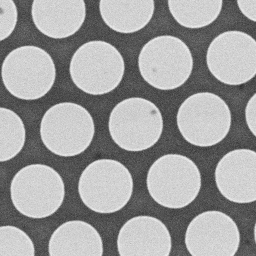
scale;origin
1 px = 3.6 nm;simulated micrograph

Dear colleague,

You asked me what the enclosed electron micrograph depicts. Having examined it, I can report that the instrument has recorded an array of small figures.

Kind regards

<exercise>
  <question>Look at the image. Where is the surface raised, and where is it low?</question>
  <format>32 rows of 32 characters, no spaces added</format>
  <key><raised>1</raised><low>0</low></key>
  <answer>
11001111110001111110011111110011
11001111111001111110011111100011
11001111110001111110001111100000
11000111110000111100000000000000
10000011000000000000000000011110
00000000000111000011111000111111
01111100001111100011111100111111
01111100011111100111111100111111
11111110011111100111111100111111
11111110011111100011111100011111
01111110011111100001111000000000
01111100000110000000000000000000
00000000000000001100000111110001
00000011110000111111000111111001
11000011111000111111001111111001
11100111111100111111001111111001
11100111111100111111000111110000
11100111111000111111000111110000
11100011111000011100000000000000
11000000000000000000011000001111
00000000000111100001111100011111
00111110000111110001111110011111
00111111001111110011111110011111
01111111001111111001111110011111
01111111001111110001111100001111
00111111000111110000111000000000
00011110000011000000000000100000
00000000000000001111000011111000
11000001111100011111100111111100
11100001111100011111100111111100
11110011111110011111100111111100
11110011111110011111100011111000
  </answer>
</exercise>